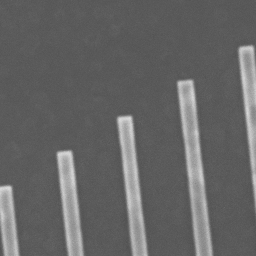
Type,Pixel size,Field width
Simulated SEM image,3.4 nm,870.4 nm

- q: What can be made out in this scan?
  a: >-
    one or a few lines or trenches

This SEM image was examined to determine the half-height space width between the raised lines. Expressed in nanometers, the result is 170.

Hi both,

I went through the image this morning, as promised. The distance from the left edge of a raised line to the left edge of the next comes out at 217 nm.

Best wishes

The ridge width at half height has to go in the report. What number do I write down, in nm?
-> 47.7